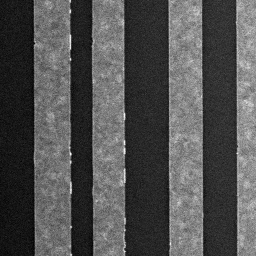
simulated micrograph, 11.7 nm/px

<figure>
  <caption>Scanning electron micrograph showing one or a few lines or trenches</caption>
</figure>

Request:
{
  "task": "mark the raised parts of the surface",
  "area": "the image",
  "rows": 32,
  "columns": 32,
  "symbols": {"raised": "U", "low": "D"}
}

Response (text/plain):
DDDDUUUUUDDDUUUDDDDDDUUUUDDDDDUU
DDDDUUUUUDDDUUUDDDDDDUUUUDDDDDUU
DDDDUUUUUDDDUUUDDDDDDUUUUDDDDDUU
DDDDUUUUUDDDUUUDDDDDDUUUUDDDDDUU
DDDDUUUUUDDDUUUDDDDDDUUUUDDDDDUU
DDDDUUUUUDDDUUUDDDDDDUUUUDDDDDUU
DDDDUUUUUDDDUUUDDDDDDUUUUDDDDDUU
DDDDUUUUUDDDUUUDDDDDDUUUUDDDDDUU
DDDDUUUUUDDDUUUDDDDDDUUUUDDDDDUU
DDDDUUUUUDDDUUUDDDDDDUUUUDDDDDUU
DDDDUUUUUDDDUUUDDDDDDUUUUDDDDDUU
DDDDUUUUUDDDUUUDDDDDDUUUUDDDDDUU
DDDDUUUUUDDDUUUDDDDDDUUUUDDDDDUU
DDDDUUUUUDDDUUUDDDDDDUUUUDDDDDUU
DDDDUUUUUDDDUUUDDDDDDUUUUDDDDDUU
DDDDUUUUUDDDUUUDDDDDDUUUUDDDDDUU
DDDDUUUUUDDDUUUDDDDDDUUUUDDDDDUU
DDDDUUUUUDDDUUUDDDDDDUUUUDDDDDUU
DDDDUUUUUDDDUUUDDDDDDUUUUDDDDDUU
DDDDUUUUUDDDUUUDDDDDDUUUUDDDDDUU
DDDDUUUUUDDDUUUDDDDDDUUUUDDDDDUU
DDDDUUUUUDDDUUUDDDDDDUUUUDDDDDUU
DDDDUUUUUDDDUUUDDDDDDUUUUDDDDDUU
DDDDUUUUUDDDUUUUDDDDDUUUUDDDDDUU
DDDDUUUUUDDDUUUUDDDDDUUUUDDDDDUU
DDDDUUUUUDDDUUUUDDDDDUUUUDDDDDUU
DDDDUUUUUDDDUUUUDDDDDUUUUDDDDDUU
DDDDUUUUUDDDUUUUDDDDDUUUUDDDDDUU
DDDDUUUUUDDDUUUUDDDDDUUUUDDDDDUU
DDDDUUUUUDDDUUUUDDDDDUUUUDDDDDUU
DDDDUUUUUDDDUUUUDDDDDUUUUDDDDDUU
DDDDUUUUUDDDUUUUDDDDDUUUUDDDDDUU